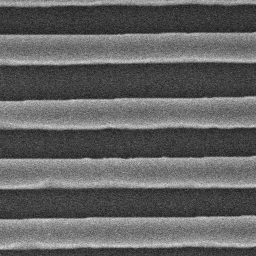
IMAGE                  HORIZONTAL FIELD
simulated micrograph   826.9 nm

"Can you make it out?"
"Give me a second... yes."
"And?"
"lines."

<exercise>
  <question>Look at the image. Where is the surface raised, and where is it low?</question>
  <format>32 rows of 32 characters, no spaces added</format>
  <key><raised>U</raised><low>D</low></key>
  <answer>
UUUUUUUUUUUUUDDDDDDUUDDDDDDDDDDD
DDDDDDDDDDDDDDDDDDDDDDDDDDDDDDDD
DDDDDDDDDDDDDDDDDDDDDDDDDDDDDDDD
DDDDDDDDDDDDDDDDDDDDDDDDDDDDDDDD
UUUUUUUUUUUUUUUUUUUUUUUUUUUUUUUU
UUUUUUUUUUUUUUUUUUUUUUUUUUUUUUUU
UUUUUUUUUUUUUUUUUUUUUUUUUUUUUUUU
UUUUUUUUUUUUUUUUUUUUUUUUUUUUUUUU
DDDDDDDDDDDDDDDDDDDDDDDDDDDDDDDD
DDDDDDDDDDDDDDDDDDDDDDDDDDDDDDDD
DDDDDDDDDDDDDDDDDDDDDDDDDDDDDDDD
DDDDDDDDDDDDDDDDDDDDDDDDDDDDDDDD
DDDDDDDDUUUUUUUUUUUUUUUUUUUUUUUU
UUUUUUUUUUUUUUUUUUUUUUUUUUUUUUUU
UUUUUUUUUUUUUUUUUUUUUUUUUUUUUUUU
UUUUUUUUUUUUUUUUUUUUUUUUUUUUUUUU
DDDDDDDDDDDDDDDDDDDDDDDDDDDDDDDD
DDDDDDDDDDDDDDDDDDDDDDDDDDDDDDDD
DDDDDDDDDDDDDDDDDDDDDDDDDDDDDDDD
DDDDDDDDDDDDDDDDDDDDDDDDDDDDDDDD
UUUUUUUUUUUUUUUUUUUUUUUUUUUUUUUU
UUUUUUUUUUUUUUUUUUUUUUUUUUUUUUUU
UUUUUUUUUUUUUUUUUUUUUUUUUUUUUUUU
DDDDDDDDDDDDDDDDDDDDDDDDDDDDDDDD
DDDDDDDDDDDDDDDDDDDDDDDDDDDDDDDD
DDDDDDDDDDDDDDDDDDDDDDDDDDDDDDDD
DDDDDDDDDDDDDDDDDDDDDDDDDDDDDDDD
DDDUUUUUUUUUUUUUUUUUUUUUUUUUUUUU
UUUUUUUUUUUUUUUUUUUUUUUUUUUUUUUU
UUUUUUUUUUUUUUUUUUUUUUUUUUUUUUUU
UUUUUUUUUUUUUUUUUUUUUUUUUUUUUUUU
DDDDDDDDDDDDDDDDDDDDDDDDDDDDDDDD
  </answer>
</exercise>